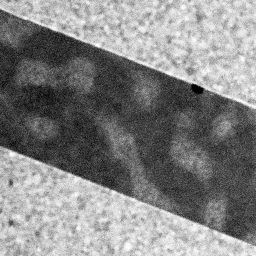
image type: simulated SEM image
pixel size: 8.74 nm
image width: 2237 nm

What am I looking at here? one or a few lines or trenches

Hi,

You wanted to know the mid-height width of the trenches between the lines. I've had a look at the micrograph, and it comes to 1.13 microns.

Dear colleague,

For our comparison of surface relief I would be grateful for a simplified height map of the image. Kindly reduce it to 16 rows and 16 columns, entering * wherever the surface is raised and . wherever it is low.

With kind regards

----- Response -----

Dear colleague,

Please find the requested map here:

****************
...*************
.....***********
........********
..........******
.............***
...............*
................
................
*...............
***.............
******..........
********........
***********.....
**************..
****************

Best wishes